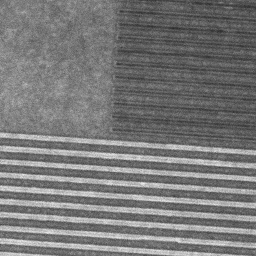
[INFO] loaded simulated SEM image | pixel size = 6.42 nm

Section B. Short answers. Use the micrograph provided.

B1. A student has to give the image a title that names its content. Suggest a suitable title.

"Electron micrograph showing parallel lines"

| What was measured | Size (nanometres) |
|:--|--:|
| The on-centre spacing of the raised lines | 84.8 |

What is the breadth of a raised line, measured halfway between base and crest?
24 nm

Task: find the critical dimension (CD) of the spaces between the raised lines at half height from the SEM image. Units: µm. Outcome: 0.06